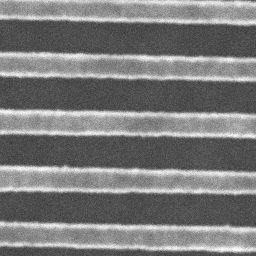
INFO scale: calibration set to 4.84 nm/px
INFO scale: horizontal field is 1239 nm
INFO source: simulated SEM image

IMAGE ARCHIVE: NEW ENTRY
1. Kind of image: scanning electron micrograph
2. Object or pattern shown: lines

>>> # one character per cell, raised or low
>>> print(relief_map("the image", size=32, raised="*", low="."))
********************************
********************************
............********************
................................
................................
................................
................................
********************************
********************************
..........*.********************
................................
................................
................................
................................
*******************************.
********************************
********************************
................................
................................
................................
................................
***********************.*.......
********************************
********************************
................................
................................
................................
................................
************************.*......
********************************
********************************
................................